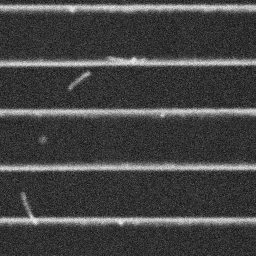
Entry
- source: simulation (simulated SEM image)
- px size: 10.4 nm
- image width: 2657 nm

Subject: lines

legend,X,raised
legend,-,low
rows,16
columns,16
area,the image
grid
XXXXXXXXXXXXXXXX
XXXXXXXXXXXXXXXX
XXXXXXXXXXXXXXXX
XXXXXXXXXXXXXXXX
----------------
----------------
----------------
XXXXXXXXXXXXXXXX
XXXXXXXXXXXXXXXX
XXXXXXXXXXXXXXXX
XXXXXX----------
----------------
----------------
----------------
XXXXXXXXXXXXXXXX
XXXXXXXXXXXXXXXX